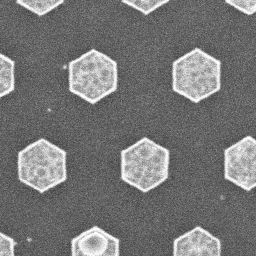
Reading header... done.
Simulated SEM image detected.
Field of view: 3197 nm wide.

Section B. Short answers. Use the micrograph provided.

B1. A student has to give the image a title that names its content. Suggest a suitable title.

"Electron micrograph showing raised bodies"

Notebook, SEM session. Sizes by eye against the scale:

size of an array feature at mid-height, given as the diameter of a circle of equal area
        596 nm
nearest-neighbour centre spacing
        1280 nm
